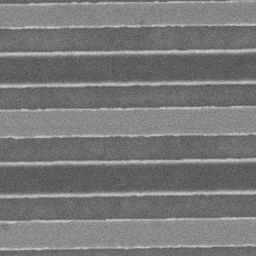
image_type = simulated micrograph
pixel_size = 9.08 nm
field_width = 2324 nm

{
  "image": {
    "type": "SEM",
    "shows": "lines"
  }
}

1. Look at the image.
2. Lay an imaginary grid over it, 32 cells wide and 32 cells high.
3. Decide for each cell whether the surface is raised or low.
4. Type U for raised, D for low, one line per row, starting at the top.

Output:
DDDUUUUUUUUUUUUUUUUUUUUUUUUUUUUU
UUUUUUUUUUUUUUUUUUUUUUUUUUUUUUUU
UUUUUUUUUUUUUUUUUUUUUUUUUUUUUUUU
DUUDDDDDDDDDDDDDDDDDDDDDDDDDDDDD
DDDDDDDDDDDDDDDDDDDDDDDDDDDDDDDD
DDDDDDDDDDDDDDDDDDDDDDDDDDDDDDDD
DDDDDDDDDDDDDDDDDDDDDUDUUUUUUUUU
UUUUUUUUUUUUUUUUUUUUUUUUUUUUUUUU
UUUUUUUUUUUUUUUUUUUUUUUUUUUUUUUU
UUUUUUUUUUUUUUUUUUUUUUUUUUUUUUUU
UUUUUUUUUUUUUUUUUUDUDDDDDDDDDDDD
DDDDDDDDDDDDDDDDDDDDDDDDDDDDDDDD
DDDDDDDDDDDDDDDDDDDDDDDDDDDDDDDD
DDDDDDDDDDDDDDDDDDDDUUUUUUUUUUUU
UUUUUUUUUUUUUUUUUUUUUUUUUUUUUUUU
UUUUUUUUUUUUUUUUUUUUUUUUUUUUUUUU
UUUUUUUUUUUUUUUUUUUUUUUUUUUUUUUU
DDDDDDDDDDDDDDDDDDDDDDDDDDDDDDDD
DDDDDDDDDDDDDDDDDDDDDDDDDDDDDDDD
DDDDDDDDDDDDDDDDDDDDDDDDDDDDDDDD
UUUUUUUUUUUUUUUUUUUUUUUUUUUUUUUU
UUUUUUUUUUUUUUUUUUUUUUUUUUUUUUUU
UUUUUUUUUUUUUUUUUUUUUUUUUUUUUUUU
UUUUUUUUUUUUUUUUUUUUUUUUUUUUUUUU
UUUUUDDDDDDDDDDDDDDDDDDDDDDDDDDD
DDDDDDDDDDDDDDDDDDDDDDDDDDDDDDDD
DDDDDDDDDDDDDDDDDDDDDDDDDDDDDDDD
DDDDDDDDDDDDDUUUUUUUUUUUUUUUUUUU
UUUUUUUUUUUUUUUUUUUUUUUUUUUUUUUU
UUUUUUUUUUUUUUUUUUUUUUUUUUUUUUUU
UUUUUUUUUUUUUUUUUUUUUUUUUUUUUUUU
DDDDDDDDDDDDDDDDDDDDDDDDDDDDDDDD